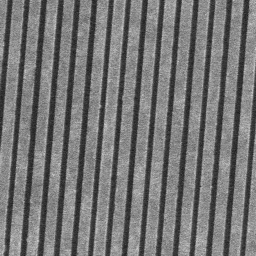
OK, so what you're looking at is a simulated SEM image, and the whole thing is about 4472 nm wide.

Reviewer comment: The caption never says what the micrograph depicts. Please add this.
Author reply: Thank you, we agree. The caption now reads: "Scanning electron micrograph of parallel lines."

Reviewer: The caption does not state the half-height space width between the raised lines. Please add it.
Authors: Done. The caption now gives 104 nm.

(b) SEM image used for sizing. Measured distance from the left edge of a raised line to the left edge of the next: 294 nanometers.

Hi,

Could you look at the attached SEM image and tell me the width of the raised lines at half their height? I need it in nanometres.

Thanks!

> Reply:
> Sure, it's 181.